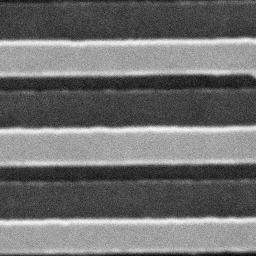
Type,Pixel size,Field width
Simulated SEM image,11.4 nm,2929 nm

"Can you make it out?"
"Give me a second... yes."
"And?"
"lines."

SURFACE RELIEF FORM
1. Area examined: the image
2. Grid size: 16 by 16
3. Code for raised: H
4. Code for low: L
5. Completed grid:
LLLLLLLLLLLLLLLL
LLLLLLLLLLLLLLLL
LLLLLLLLLLLLLHHH
HHHHHHHHHHHHHHHH
HHHHHHHHHHHHHHHL
LLLLLLLLLLLLLLLL
LLLLLLLLLLLLLLLL
LLLLLLLLLLLLLLLL
HHHHHHHHHHHHHHHH
HHHHHHHHHHHHHHHH
LLLLLLLLLLLLLLLL
LLLLLLLLLLLLLLLL
LLLLLLLLLLLLLLLL
LLLLLLLLLLLLLLLL
HHHHHHHHHHHHHHHH
HHHHHHHHHHHHHHHH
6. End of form